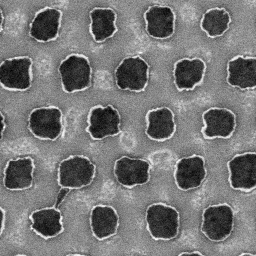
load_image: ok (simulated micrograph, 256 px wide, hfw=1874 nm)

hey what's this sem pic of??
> a regular array of raised bodies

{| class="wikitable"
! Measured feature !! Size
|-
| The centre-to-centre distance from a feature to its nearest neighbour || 412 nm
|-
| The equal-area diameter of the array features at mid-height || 0.243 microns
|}